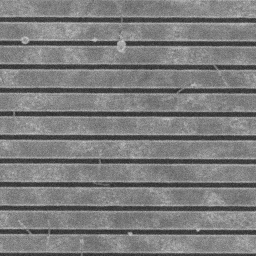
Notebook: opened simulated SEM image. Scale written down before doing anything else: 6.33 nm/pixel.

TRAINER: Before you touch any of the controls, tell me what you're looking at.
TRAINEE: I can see parallel lines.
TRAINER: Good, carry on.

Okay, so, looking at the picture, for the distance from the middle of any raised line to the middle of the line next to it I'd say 149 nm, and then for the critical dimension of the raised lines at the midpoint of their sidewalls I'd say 116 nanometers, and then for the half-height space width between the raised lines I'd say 35.6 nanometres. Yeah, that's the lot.